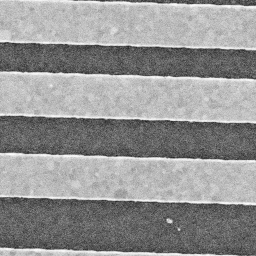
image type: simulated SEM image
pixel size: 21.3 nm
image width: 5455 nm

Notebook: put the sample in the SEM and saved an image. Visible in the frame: lines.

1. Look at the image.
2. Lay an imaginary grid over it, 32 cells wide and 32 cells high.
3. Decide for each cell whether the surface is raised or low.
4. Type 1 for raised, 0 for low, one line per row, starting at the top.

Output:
11111111111111111110000000000000
11111111111111111111111111111111
11111111111111111111111111111111
11111111111111111111111111111111
11111111111111111111111111111111
00000000000001111111111111111111
00000000000000000000000000000000
00000000000000000000000000000000
00000000000000000000000000000000
11111111111111111100000000000000
11111111111111111111111111111111
11111111111111111111111111111111
11111111111111111111111111111111
11111111111111111111111111111111
00000001111111111111111111111111
00000000000000000000000000000000
00000000000000000000000000000000
00000000000000000000000000000000
00000000000000000000000000000000
11111111110000000000000000000000
11111111111111111111111111111111
11111111111111111111111111111111
11111111111111111111111111111111
11111111111111111111111111111111
11111111111111111111111111111111
00000000000000000000000000000001
00000000000000000000000000000000
00000000000000000000000000000000
00000000000000000000000000000000
00000000000000000000000000000000
00000000000000000000000000000000
11111111111000000000000000000000